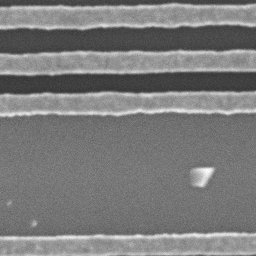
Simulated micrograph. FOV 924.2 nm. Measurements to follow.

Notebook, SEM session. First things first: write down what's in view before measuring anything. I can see lines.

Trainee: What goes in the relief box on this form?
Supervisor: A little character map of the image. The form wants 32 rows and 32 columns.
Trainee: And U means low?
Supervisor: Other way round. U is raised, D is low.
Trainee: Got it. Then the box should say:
DDDDDDDDDDDDDDDDDDDDDUUDDDDDDDDD
UUUUUUUUUUUUUUUUUUUUUUUUUUUUUUUU
UUUUUUUUUUUUUUUUUUUUUUUUUUUUUUUU
UUUUUUUUUUUUDDDDDDDDDDDDDDDDDDDD
DDDDDDDDDDDDDDDDDDDDDDDDDDDDDDDD
DDDDDDDDDDDDDDDDDDDDDDDDDDDDDDDD
DDDDDDDDDUUUDDDDUUDDDUUUUUUDUUUU
UUUUUUUUUUUUUUUUUUUUUUUUUUUUUUUU
UUUUUUUUUUUUUUUUUUUUUUUUUUUUUUUU
DDDDDDDDDDDDDDDDDDDDDDDDDDDDDDDD
DDDDDDDDDDDDDDDDDDDDDDDDDDDDDDDD
DDDDDDDDDDDDDDDDDDDDDDDDDUDDDDDU
UUUUUUUUUUUUUUUUUUUUUUUUUUUUUUUU
UUUUUUUUUUUUUUUUUUUUUUUUUUUUUUUU
DDDDDDDDDDDDDDDDDDDDDDDDDDDDDDDD
DDDDDDDDDDDDDDDDDDDDDDDDDDDDDDDD
DDDDDDDDDDDDDDDDDDDDDDDDDDDDDDDD
DDDDDDDDDDDDDDDDDDDDDDDDDDDDDDDD
DDDDDDDDDDDDDDDDDDDDDDDDDDDDDDDD
DDDDDDDDDDDDDDDDDDDDDDDDDDDDDDDD
DDDDDDDDDDDDDDDDDDDDDDDDDDDDDDDD
DDDDDDDDDDDDDDDDDDDDDDDDDDDDDDDD
DDDDDDDDDDDDDDDDDDDDDDDDDDDDDDDD
DDDDDDDDDDDDDDDDDDDDDDDDDDDDDDDD
DDDDDDDDDDDDDDDDDDDDDDDDDDDDDDDD
DDDDDDDDDDDDDDDDDDDDDDDDDDDDDDDD
DDDDDDDDDDDDDDDDDDDDDDDDDDDDDDDD
DDDDDDDDDDDDDDDDDDDDDDDDDDDDDDDD
DDDDDDDDDDDDDDDDDDDDDDDDDDDDDDDD
DDDDDDDDDDDUUDDDDUDUUUUUUUUUUUUU
UUUUUUUUUUUUUUUUUUUUUUUUUUUUUUUU
UUUUUUUUUUUUUUUUUUUUUUUUUUUUUUUU